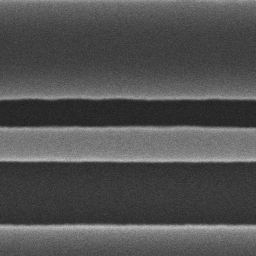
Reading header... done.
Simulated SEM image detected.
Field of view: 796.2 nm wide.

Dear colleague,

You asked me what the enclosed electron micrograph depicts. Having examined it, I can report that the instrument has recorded lines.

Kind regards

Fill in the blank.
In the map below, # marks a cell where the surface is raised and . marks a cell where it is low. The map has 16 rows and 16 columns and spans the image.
################
################
################
################
################
################
................
................
################
################
................
................
................
................
################
################